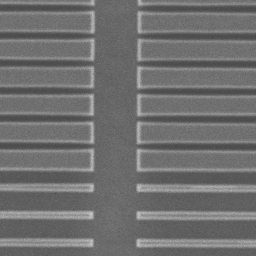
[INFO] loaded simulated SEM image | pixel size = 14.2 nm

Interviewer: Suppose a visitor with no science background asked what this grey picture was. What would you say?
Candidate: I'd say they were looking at groups of lines, slits or small figures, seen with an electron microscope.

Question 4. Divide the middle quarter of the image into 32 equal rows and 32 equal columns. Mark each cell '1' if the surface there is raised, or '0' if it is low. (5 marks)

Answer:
00000000000000000000000000000000
11111110000000000001111111111111
11111110000000000001111111111111
11111110000000000001111111111111
11111110000000000001111111111111
11111110000000000001111111111111
00000000000000000000000000000000
00000000000000000000000000000000
11111110000000000001111111111111
11111110000000000001111111111111
11111110000000000001111111111111
11111110000000000001111111111111
11111110000000000001111111111111
00000000000000000000000000000000
00000000000000000000000000000000
11111110000000000001111111111111
11111110000000000001111111111111
11111110000000000001111111111111
11111110000000000001111111111111
11111110000000000001111111111111
00000000000000000000000000000000
00000000000000000000000000000000
11111110000000000001111111111111
11111110000000000001111111111111
11111110000000000001111111111111
11111110000000000001111111111111
00011110000000000001111111111111
00000000000000000000000000000000
00000000000000000000000000000000
00000000000000000000000000000000
11111110000000000001111111111111
00000000000000000000000111111111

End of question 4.